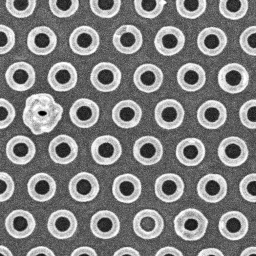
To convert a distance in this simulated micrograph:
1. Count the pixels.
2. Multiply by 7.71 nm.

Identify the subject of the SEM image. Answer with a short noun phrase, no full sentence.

a regular array of ring-shaped raised bodies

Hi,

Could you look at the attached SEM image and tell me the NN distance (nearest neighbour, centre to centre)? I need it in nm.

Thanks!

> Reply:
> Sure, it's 321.